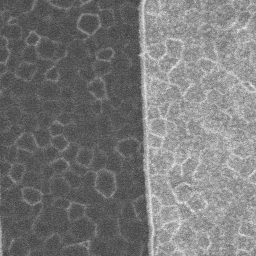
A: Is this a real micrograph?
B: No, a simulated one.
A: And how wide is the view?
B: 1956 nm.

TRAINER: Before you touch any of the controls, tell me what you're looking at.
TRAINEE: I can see one or a few lines or trenches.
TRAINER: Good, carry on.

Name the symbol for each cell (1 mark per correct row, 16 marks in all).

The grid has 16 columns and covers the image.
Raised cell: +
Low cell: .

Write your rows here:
.........+++++++
.........+++++++
.........+++++++
.........+++++++
.........+++++++
.........+++++++
.........+++++++
.........+++++++
.........+++++++
.........+++++++
.........+++++++
.........+++++++
.........+++++++
.........+++++++
..........++++++
..........++++++